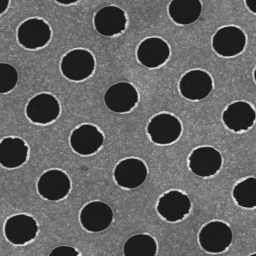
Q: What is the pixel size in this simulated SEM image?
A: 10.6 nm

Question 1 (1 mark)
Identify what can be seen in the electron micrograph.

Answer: a regular array of holes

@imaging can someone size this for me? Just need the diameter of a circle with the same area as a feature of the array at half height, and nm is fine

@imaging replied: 333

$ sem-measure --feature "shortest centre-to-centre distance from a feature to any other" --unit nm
566